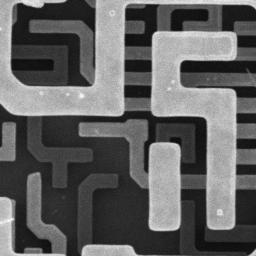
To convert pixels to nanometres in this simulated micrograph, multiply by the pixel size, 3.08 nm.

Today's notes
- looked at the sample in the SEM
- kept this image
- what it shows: wiring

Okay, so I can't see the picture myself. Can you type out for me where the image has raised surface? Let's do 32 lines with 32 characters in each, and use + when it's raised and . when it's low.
++.+++......++++.............+++
+...........++++................
+...........++++................
+...........+++.................
+...........+++....+++++++++++..
+...........+++....+++++++++++..
+...........+++....+++++++++++..
+...........+++....++++++++++...
+...........+++....+++..........
++..........+++....+++..........
+++.........+++....++++.........
+++++++++++++++....++++++++++...
+++++++++++++++....+++++++++++..
.++++++++++++++....+++++++++++..
.........................++++...
..........................++++..
..........................++++..
..........................++++..
...................+++....+++...
...................++++...+++...
...................+++....+++...
...................+++....+++...
...................+++....+++...
...................+++....+++...
...................+++....+++...
+..................++++...+++...
+..................++++...+++...
+..................++++...+++...
+..................+++....+++...
+...............................
+...............................
++........+++++++...............